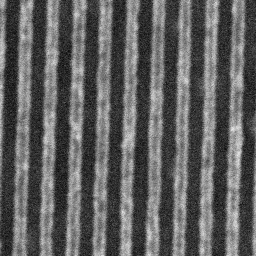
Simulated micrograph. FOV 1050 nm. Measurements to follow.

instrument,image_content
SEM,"parallel lines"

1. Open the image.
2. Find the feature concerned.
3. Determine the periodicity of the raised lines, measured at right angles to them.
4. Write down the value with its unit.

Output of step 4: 109 nm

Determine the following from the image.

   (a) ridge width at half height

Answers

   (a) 36.4 nanometres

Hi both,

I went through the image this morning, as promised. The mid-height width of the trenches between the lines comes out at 0.0723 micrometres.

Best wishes